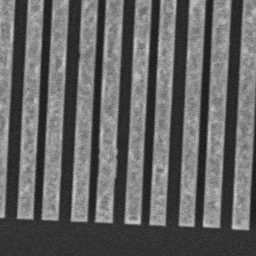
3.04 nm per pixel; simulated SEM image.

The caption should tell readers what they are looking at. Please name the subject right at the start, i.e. parallel lines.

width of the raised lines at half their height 50.5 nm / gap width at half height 35.3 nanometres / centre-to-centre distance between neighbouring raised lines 0.0814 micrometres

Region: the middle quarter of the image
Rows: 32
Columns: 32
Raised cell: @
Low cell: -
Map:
----@@@@--@@@@---@@@@--@@@@----@
----@@@---@@@@---@@@@--@@@@----@
----@@@---@@@@---@@@@--@@@@----@
----@@@---@@@@---@@@@--@@@@----@
----@@@---@@@@---@@@@--@@@@---@@
----@@@--@@@@@---@@@@--@@@@---@@
----@@@--@@@@@---@@@@--@@@@---@@
---@@@@--@@@@@---@@@@--@@@@---@@
---@@@@--@@@@----@@@@--@@@@---@@
---@@@@--@@@@----@@@@--@@@@---@@
---@@@@--@@@@----@@@---@@@@---@@
---@@@@--@@@@----@@@---@@@@---@@
---@@@@--@@@@----@@@---@@@@---@@
---@@@@--@@@@----@@@---@@@@---@@
---@@@@--@@@@----@@@---@@@@---@@
---@@@@--@@@@----@@@---@@@@---@@
---@@@@--@@@@---@@@@---@@@----@@
---@@@@--@@@@---@@@@---@@@----@@
---@@@@--@@@@---@@@@--@@@@----@@
---@@@@--@@@@---@@@@--@@@@----@@
---@@@@--@@@@---@@@@--@@@@----@@
---@@@@--@@@@---@@@@--@@@@----@@
---@@@---@@@@---@@@@--@@@@----@@
---@@@---@@@@---@@@@--@@@@----@@
--@@@@---@@@@---@@@@--@@@@---@@@
--@@@@---@@@@---@@@@--@@@@---@@@
--@@@@@--@@@@---@@@@--@@@@---@@@
--@@@@---@@@@---@@@@--@@@@---@@@
--@@@@---@@@@---@@@@--@@@@---@@@
--@@@@---@@@----@@@@--@@@@---@@@
--@@@@--@@@@----@@@---@@@@---@@@
--@@@@--@@@@----@@@---@@@@---@@@